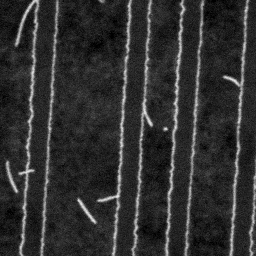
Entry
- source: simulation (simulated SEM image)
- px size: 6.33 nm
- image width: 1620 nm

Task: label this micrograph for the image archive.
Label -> lines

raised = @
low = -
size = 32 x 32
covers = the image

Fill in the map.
-----@@---------@@@----@@------@
----@@@---------@@@----@@------@
----@@@---------@@@----@@------@
----@@@---------@@@----@@------@
----@@@---------@@@---@@@------@
----@@@---------@@@---@@@------@
----@@@---------@@----@@@-----@@
----@@@---------@@----@@@-----@@
----@@@---------@@----@@@-----@@
----@@@---------@@----@@@-----@@
----@@@---------@@----@@@-----@@
----@@@--------@@@----@@@-----@@
----@@---------@@@----@@@-----@@
----@@---------@@@----@@------@@
----@@---------@@@----@@------@@
----@@---------@@@----@@------@@
----@@---------@@@----@@------@@
----@@---------@@@----@@------@@
---@@@---------@@@----@@------@@
----@@---------@@@----@@------@@
---@@@---------@@@----@@------@@
---@@@---------@@@---@@@------@@
---@@@---------@@@---@@@-----@@@
---@@@---------@@----@@@-----@@@
---@@@---------@@----@@@-----@@@
---@@@---------@@----@@@-----@@@
---@@@--------@@@----@@@-----@@@
---@@@--------@@@----@@@-----@@@
---@@---------@@@----@@------@@@
---@@---------@@@----@@------@@-
---@@---------@@@----@@------@@@
---@@---------@@@----@@------@@-